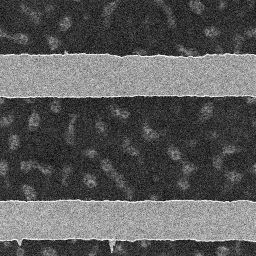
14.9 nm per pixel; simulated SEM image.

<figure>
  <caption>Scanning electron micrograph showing one or a few lines or trenches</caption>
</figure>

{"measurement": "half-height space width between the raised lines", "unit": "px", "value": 104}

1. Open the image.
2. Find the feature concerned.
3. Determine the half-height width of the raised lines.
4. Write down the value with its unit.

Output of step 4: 596 nm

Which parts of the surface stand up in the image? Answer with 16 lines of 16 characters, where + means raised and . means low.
................
................
................
+++++++.+....+++
++++++++++++++++
++++++++++++++++
................
................
................
................
................
................
................
++++++++++++++++
++++++++++++++++
................